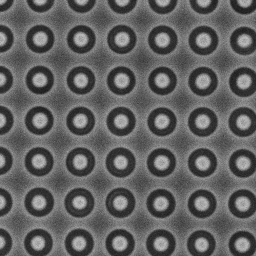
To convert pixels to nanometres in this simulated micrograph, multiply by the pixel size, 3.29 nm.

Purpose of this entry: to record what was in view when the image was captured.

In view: an array of small figures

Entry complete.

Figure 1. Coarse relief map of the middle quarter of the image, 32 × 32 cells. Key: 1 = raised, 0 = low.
11110111111111111111111111111111
11000001111100000111110000011111
10000001111000000011100000001111
10011000111001110011100111001110
10011000111001110011100111001110
10001000111000100011100010001110
11000001111100000111110000011111
11100011111110001111111000111111
11111111111111111111111111111111
11111111111111111111111111111111
11111111111111111111111111111111
11000001111100000111110000011111
10000001111000000111100000001110
00011000111001100011100111001110
00011000110001110011100111001110
10011000111001100011100110001110
10000001111000000111100000001111
11100011111100001111110000011111
11111111111111111111111111111111
11111111111111111111111111111111
11111111111111111111111111111111
11000011111100000111110000111111
10000001111000000111100000011111
10011000111001100011100111001110
00011000110001100011100111001110
10011000110001100011100111001110
10000001111000000011100000001110
11000011111100000111110000011111
11111111111111011111111111111111
11111111111111111111111111111111
11111111111111111111111111111111
11000011111100001111111000111111